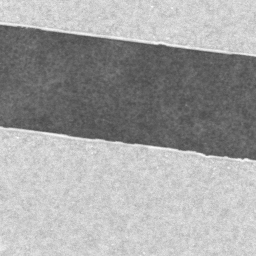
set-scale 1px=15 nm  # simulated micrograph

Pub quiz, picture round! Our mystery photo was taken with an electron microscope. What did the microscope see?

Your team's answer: one or a few lines or trenches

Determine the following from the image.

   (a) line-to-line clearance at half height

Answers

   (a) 1570 nanometres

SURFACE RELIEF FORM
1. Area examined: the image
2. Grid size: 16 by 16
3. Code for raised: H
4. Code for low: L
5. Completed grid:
HHHHHHHHHHHHHHHH
LHHHHHHHHHHHHHHH
LLLLLLLLHHHHHHHH
LLLLLLLLLLLLLLLL
LLLLLLLLLLLLLLLL
LLLLLLLLLLLLLLLL
LLLLLLLLLLLLLLLL
LLLLLLLLLLLLLLLL
HHHHLLLLLLLLLLLL
HHHHHHHHHHHLLLLL
HHHHHHHHHHHHHHHH
HHHHHHHHHHHHHHHH
HHHHHHHHHHHHHHHH
HHHHHHHHHHHHHHHH
HHHHHHHHHHHHHHHH
HHHHHHHHHHHHHHHH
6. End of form